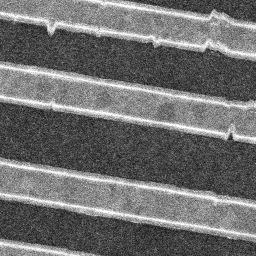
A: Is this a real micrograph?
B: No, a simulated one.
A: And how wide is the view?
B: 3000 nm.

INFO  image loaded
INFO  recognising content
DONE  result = one or a few lines or trenches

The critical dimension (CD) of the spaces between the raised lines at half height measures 53.3 px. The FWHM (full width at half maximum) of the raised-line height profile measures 346 nm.